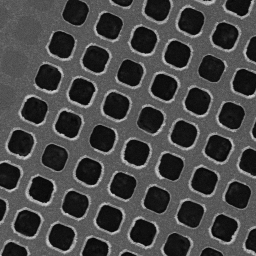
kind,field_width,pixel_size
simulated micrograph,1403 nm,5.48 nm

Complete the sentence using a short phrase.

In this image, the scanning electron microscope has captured a regular array of holes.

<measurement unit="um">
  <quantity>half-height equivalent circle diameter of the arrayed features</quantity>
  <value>0.143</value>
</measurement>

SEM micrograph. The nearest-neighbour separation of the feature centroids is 194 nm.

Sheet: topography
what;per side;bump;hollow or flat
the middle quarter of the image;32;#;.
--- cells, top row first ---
#####.....####.....#########..##
######....####......############
#############.......####.#######
#############......####....#####
##.....#######.....###......####
##......########..####......####
#.......##############......###.
#......####...########......###.
#......###......########...####.
###...####......##############..
##########......##############..
##########......###.....#######.
...#######......###......#######
....########...####......#######
....##############.......###...#
....####..#########.....###.....
....###.....########....###.....
...####......##############.....
######.......##############.....
######.......###....#######.....
#######.....####.....########...
.########...###......###########
.##############......####..#####
.####.#########......###.....###
####....########....####......##
###......#########.#####......##
###......###############......##
###......####...########.....###
###......###......#######....###
#####...####......##############
############......##############
############......###....#######